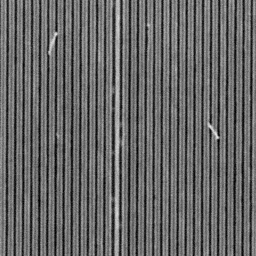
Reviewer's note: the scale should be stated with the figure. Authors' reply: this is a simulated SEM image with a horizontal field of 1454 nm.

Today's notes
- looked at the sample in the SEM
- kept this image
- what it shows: parallel lines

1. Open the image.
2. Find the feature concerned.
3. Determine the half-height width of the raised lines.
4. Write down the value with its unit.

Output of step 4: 28.4 nm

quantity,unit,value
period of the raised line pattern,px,8.13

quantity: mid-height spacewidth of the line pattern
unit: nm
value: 19.2